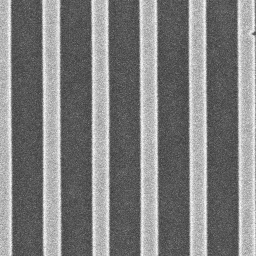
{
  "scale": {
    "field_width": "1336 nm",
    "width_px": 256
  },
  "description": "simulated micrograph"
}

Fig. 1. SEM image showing parallel lines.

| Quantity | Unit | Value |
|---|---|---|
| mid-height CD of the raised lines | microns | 0.0855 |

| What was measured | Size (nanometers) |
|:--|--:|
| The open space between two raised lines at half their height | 170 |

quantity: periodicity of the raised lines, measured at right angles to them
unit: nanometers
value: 255